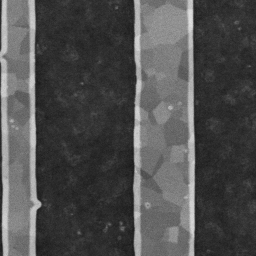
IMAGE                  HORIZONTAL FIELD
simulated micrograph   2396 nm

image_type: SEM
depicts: one or a few lines or trenches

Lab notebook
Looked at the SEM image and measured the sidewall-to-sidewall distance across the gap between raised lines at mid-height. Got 975 nanometres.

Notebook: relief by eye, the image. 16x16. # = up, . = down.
##.......###....
##.......###....
##.......###....
##.......###....
##.......###....
##.......###....
##.......###....
##.......###....
##.......###....
##......####....
##.......###....
##.......###....
##.......###....
##.......###....
##.......###....
##.......###....